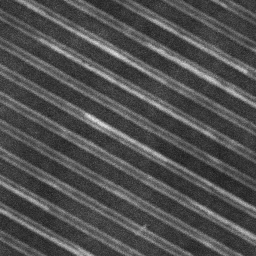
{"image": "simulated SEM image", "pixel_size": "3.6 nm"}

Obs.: parallel lines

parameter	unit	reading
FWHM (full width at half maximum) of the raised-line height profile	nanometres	28.2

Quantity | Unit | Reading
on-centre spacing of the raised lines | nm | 86.5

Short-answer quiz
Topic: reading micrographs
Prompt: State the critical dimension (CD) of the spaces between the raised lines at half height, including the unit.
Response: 56.4 nm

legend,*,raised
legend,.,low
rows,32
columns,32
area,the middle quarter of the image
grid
.....****........****.........**
.......****........****.........
........*****........****.......
**........****.........****.....
****........****........****....
..****........****........****..
....***.........****........****
.....****.........****........**
.......****........****.........
*........****........****.......
**.........***.........****.....
****........****........*****...
..****........****........****..
....****........****........****
......****........****........**
........***.........***.........
*........****........****.......
**.........****........****.....
****.........****........****...
..****........****.........***..
....****........****........****
......***.........****........**
.......****.........****........
*........****.........****......
***........****.........***.....
.****........****........****...
...***.........***.........****.
....****........****........****
......****........****........**
........****........****........
*........****.........****......
***........****........****.....